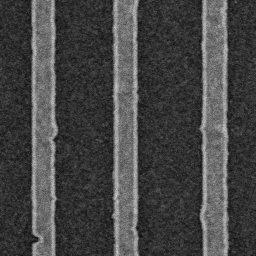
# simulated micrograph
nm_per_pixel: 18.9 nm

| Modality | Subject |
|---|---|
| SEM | one or a few lines or trenches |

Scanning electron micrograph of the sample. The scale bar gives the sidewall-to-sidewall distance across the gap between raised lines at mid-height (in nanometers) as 1260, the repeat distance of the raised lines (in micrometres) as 1.62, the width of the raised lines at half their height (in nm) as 363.